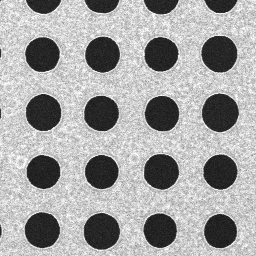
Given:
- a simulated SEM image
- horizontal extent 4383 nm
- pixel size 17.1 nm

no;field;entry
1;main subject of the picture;a regular array of holes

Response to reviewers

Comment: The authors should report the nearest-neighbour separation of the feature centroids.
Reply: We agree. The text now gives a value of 58.3 pixels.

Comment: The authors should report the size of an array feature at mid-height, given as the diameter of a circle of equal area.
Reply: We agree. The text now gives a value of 0.607 um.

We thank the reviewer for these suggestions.